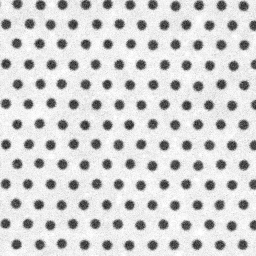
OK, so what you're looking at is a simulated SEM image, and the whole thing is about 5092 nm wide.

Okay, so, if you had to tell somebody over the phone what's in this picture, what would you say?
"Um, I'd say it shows a regular array of holes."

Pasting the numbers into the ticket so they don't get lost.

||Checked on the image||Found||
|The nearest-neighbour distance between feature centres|439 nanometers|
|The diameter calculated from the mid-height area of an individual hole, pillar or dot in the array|214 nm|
